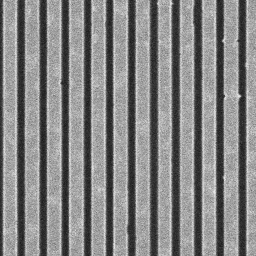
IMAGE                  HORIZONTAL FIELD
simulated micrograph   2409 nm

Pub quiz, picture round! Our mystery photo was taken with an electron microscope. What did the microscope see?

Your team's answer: parallel lines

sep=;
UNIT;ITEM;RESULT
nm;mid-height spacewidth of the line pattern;71.7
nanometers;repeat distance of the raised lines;208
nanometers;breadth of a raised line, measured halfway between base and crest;136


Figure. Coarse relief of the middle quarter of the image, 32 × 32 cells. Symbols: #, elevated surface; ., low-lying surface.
.####..###..####..###...###..###
.####..###..####..###...###..###
.####..###..####..###...###..###
.####..###..####..###...###..###
.####..###..####..###...###..###
.####..###..####..###...###..###
.####..###..####..###...###..###
.####..###..####..###...###..###
.####..###..####..###...###..###
.####..###..####..###...###..###
.####..###..####..###...###..###
.####..###..####..###...###..###
.####..###..####..###...###..###
.####..###..####..###...###..###
.####..###..####..###...###..###
.####..###..####..###...###..###
.####..###..####..###...###..###
.####..###..####..###...###..###
.####..###..####..###...###..###
.####..###..####..###...###..###
.####..###..####..###...###..###
.####..###..####..###...###..###
.####..###..####..###...###..###
.####..###..####..###...###..###
.####..###..####..###...###..###
.####..###..####..###...###..###
.####..###..####..###...###..###
.####..###..####..###...###..###
.####..###..####..###...###..###
.####..###..####..###...###..###
.####..###..####..###...###..###
.####..###..####..###...###..###